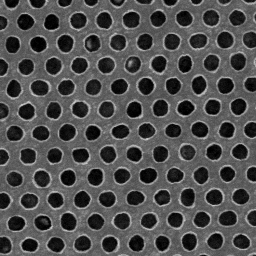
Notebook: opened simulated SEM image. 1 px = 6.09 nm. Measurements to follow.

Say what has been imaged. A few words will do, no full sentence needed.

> a regular array of holes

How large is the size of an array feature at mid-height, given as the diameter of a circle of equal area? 0.0994 µm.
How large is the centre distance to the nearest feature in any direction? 154 nanometres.